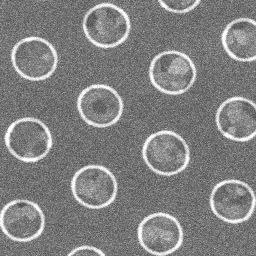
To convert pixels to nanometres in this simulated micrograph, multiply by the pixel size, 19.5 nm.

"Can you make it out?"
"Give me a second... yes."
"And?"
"a regular array of raised bodies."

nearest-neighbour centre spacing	1540	nm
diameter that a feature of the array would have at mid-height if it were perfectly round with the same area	812	nm